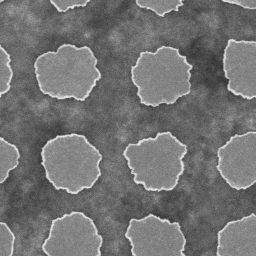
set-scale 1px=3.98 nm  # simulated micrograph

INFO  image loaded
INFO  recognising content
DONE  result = raised bodies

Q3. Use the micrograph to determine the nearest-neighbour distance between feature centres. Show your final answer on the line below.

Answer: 340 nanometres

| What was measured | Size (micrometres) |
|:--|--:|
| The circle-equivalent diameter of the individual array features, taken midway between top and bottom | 0.232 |